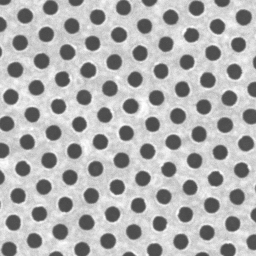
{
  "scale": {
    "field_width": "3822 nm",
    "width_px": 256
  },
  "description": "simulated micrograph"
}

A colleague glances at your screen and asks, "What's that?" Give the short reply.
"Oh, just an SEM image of a regular array of holes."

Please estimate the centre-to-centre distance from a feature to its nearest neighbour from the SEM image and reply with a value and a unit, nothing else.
0.403 µm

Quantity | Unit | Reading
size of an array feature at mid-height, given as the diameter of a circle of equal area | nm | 238